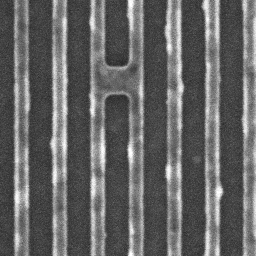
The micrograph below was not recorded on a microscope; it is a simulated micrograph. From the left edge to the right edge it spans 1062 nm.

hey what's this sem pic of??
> parallel lines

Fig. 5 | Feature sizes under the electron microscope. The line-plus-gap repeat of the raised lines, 158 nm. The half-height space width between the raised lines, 103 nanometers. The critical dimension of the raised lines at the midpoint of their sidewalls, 53.5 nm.